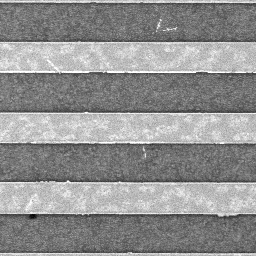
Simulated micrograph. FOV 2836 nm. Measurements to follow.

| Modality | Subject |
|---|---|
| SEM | one or a few lines or trenches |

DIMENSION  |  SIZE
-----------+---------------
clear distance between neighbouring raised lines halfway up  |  453 nm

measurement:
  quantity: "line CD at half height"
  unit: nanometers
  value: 320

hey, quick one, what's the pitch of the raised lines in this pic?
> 779 nm